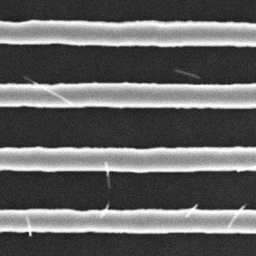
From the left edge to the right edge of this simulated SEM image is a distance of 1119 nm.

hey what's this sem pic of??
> lines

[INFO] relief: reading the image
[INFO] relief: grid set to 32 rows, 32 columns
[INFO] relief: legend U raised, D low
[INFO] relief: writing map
DDDDDDDDDDDDDDDDDDDDDDDDDDDDDDDD
DDDDDDDDDDDDDDDDDDDDDDDDDDDDDDDD
DDDDDDDDDDDDDDDDDDDDDDDDDDDDDDDD
UUUUUUUUUUUUUUUUUUUUUUUUUUUUUUUU
UUUUUUUUUUUUUUUUUUUUUUUUUUUUUUUU
DDDDDDDDDUUUUUUUUUUUUUUUUUUUUUUU
DDDDDDDDDDDDDDDDDDDDDDDDDDDDDDDD
DDDDDDDDDDDDDDDDDDDDDDDDDDDDDDDD
DDDDDDDDDDDDDDDDDDDDDDDDDDDDDDDD
DDDDDDDDDDDDDDDDDDDDDDDDDDDDDDDD
DDDDDDDDDDUUUUUUUUUDDDDDDDDDDDDD
UUUUUUUUUUUUUUUUUUUUUUUUUUUUUUUU
UUUUUUUUUUUUUUUUUUUUUUUUUUUUUUUU
DDDDDDDDDDDDDDDDDDDDDDDDDDDDDDUD
DDDDDDDDDDDDDDDDDDDDDDDDDDDDDDDD
DDDDDDDDDDDDDDDDDDDDDDDDDDDDDDDD
DDDDDDDDDDDDDDDDDDDDDDDDDDDDDDDD
DDDDDDDDDDDDDDDDDDDDDDDDDDDDDDDD
UDDUUUDDUDDDDDDDDDDDUDDDDUUDDUUU
UUUUUUUUUUUUUUUUUUUUUUUUUUUUUUUU
UUUUUUUUUUUUUUUUUUUUUUUUUUUUUUUU
DDDDDDDDDDDDDDDDDUDDDDDDDDDDDDDD
DDDDDDDDDDDDDDDDDDDDDDDDDDDDDDDD
DDDDDDDDDDDDDDDDDDDDDDDDDDDDDDDD
DDDDDDDDDDDDDDDDDDDDDDDDDDDDDDDD
DDDDDDDDDDDDDDDDDDDDDDDDDDDDDDDD
UUUUUUUUUUUUUUUUUUUUUUUUUUUUUUUU
UUUUUUUUUUUUUUUUUUUUUUUUUUUUUUUU
UUUUUUUUUUUUUUUUUUUUUUUUUUUUUUUU
DDDDDDDDDDDDDDDDDDDDDDDDDDDDDDDD
DDDDDDDDDDDDDDDDDDDDDDDDDDDDDDDD
DDDDDDDDDDDDDDDDDDDDDDDDDDDDDDDD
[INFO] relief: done